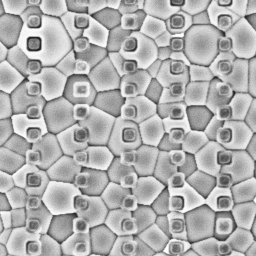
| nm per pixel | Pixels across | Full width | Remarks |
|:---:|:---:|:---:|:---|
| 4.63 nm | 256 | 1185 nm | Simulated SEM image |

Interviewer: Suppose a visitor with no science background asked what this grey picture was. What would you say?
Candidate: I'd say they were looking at a regular array of raised bodies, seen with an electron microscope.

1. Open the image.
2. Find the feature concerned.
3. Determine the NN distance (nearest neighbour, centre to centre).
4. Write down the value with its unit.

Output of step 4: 88.5 nanometres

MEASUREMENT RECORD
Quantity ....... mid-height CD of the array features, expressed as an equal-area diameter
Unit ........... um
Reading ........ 0.0536